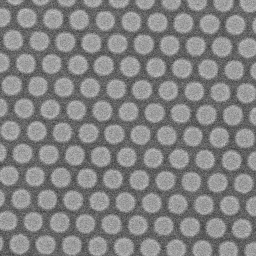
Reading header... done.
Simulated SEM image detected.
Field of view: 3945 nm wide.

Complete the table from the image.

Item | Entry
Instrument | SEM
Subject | an array of small figures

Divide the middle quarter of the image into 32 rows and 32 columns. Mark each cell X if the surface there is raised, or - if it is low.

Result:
-XXXXX--XXXX--XXXXX--XXXX--XXXXX
--XXX---XXXX--XXXXX--XXXX--XXXXX
---------XX----XXX----XXX---XXX-
--------------------------------
XX---XXX----XX----XX------------
XX--XXXXX--XXXX--XXXXX--XXXX---X
XX--XXXXX--XXXX--XXXXX--XXXX--XX
X----XXX---XXXX---XXX---XXXX--XX
-------------------X-----XX----X
--XX----------------------------
-XXXX---XXX----XXX---XXX----XX--
-XXXX--XXXXX--XXXX---XXXX--XXXX-
-XXXX--XXXXX--XXXX--XXXXX--XXXX-
--XX----XXX---XXXX---XXX---XXXX-
-----------------------------X--
X----XXX----XX------------------
XX--XXXX--XXXXX--XXXX---XXX----X
XX--XXXX--XXXXX--XXXX---XXXX--XX
X---XXXX---XXXX--XXXX---XXXX--XX
------------XX----XXX---XXX----X
--------------------------------
-XXX----XXX---XXX----XX---------
XXXXX--XXXX---XXXX--XXXX---XXXX-
-XXXX--XXXX---XXXX--XXXX---XXXX-
-XXX---XXXX---XXXX--XXXX---XXXX-
---------------------XX-----XX--
-----X--------------------------
X---XXXX--XXXX---XXXX---XXX----X
X---XXXX--XXXX---XXXX--XXXX---XX
X---XXXX--XXXX---XXXX--XXXX---XX
-----XX----XXX---XXXX---XXX---XX
-------------------------------X